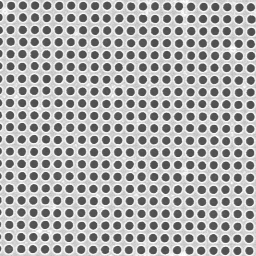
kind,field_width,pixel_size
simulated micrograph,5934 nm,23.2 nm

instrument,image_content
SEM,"a regular array of holes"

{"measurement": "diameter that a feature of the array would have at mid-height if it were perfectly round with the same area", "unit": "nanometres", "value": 199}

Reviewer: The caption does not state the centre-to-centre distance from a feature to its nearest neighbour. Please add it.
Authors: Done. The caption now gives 273 nm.